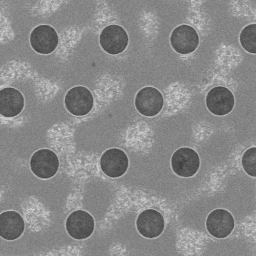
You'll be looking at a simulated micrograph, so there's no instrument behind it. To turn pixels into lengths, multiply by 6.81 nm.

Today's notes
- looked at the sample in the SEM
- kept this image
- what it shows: a regular array of holes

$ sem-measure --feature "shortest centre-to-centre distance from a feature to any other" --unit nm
475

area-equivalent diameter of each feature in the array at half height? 197 nm